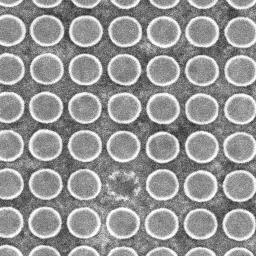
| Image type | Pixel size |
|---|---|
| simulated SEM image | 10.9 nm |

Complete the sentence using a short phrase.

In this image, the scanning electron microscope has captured a regular array of raised bodies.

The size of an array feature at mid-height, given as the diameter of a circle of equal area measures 331 nanometres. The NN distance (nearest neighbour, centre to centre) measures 38.2 pixels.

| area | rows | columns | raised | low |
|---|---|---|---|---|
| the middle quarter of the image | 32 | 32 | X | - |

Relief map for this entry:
--XXXXXXX--XXXXXXXX--XXXXXXX---X
--XXXXXXX--XXXXXXXX--XXXXXXXX--X
--XXXXXXX--XXXXXXXX--XXXXXXXX--X
--XXXXXXX---XXXXXX---XXXXXXX---X
---XXXX------XXXX-----XXXXX-----
--------------------------------
--------------------------------
--------------XX----------------
--XXXXXX----XXXXXX----XXXXX-----
--XXXXXXX---XXXXXXX--XXXXXXX---X
-XXXXXXXX--XXXXXXXX--XXXXXXX---X
-XXXXXXXX--XXXXXXXX--XXXXXXXX--X
--XXXXXXX--XXXXXXXX--XXXXXXX---X
---XXXXX----XXXXXX----XXXXXX---X
-----X-------XXX-------XXX------
--------------------------------
--------------------------------
---XXXX------XXXX------XXX------
--XXXXXXX---XXXXXX----XXXXXX---X
-XXXXXXXX--XXXXXXX---XXXXXXX---X
-XXXXXXXX--XXXXXXXX--XXXXXXXX--X
--XXXXXXX--XXXXXXXX--XXXXXXXX--X
--XXXXXX----XXXXXX---XXXXXXX---X
---XXXX------XXXX-----XXXXXX----
--------------------------------
--------------------------------
--------------------------------
--XXXXXX--------------XXXXX-----
-XXXXXXX-------------XXXXXXX---X
-XXXXXXXX------------XXXXXXX---X
-XXXXXXXX------------XXXXXXX---X
-XXXXXXXX------------XXXXXXX---X